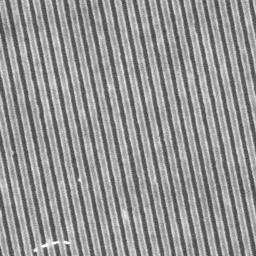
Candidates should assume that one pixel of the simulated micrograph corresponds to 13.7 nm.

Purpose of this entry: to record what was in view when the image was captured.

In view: parallel lines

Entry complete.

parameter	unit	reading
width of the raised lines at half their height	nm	82.2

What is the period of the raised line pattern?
155 nm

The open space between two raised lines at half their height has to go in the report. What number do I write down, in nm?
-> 70.5